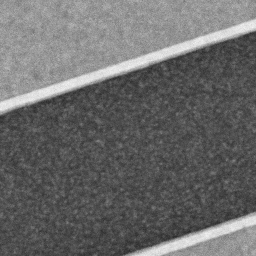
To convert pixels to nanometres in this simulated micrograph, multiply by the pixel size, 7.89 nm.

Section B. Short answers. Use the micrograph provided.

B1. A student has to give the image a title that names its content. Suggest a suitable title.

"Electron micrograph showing one or a few lines or trenches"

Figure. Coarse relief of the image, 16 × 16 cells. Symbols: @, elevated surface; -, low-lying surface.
@@@@@@@@@@@@@@@@
@@@@@@@@@@@@@@@@
@@@@@@@@@@@@@---
@@@@@@@@@@------
@@@@@@@---------
@@@@------------
@---------------
----------------
----------------
----------------
----------------
----------------
----------------
----------------
--------------@@
----------@@@@@@